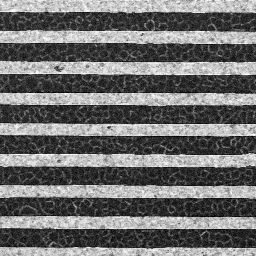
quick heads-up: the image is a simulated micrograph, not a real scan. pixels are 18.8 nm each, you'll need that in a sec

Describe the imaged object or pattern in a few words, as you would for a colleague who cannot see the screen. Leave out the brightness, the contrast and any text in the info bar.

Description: parallel lines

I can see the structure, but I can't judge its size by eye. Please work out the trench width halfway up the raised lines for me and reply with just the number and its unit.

19.3 pixels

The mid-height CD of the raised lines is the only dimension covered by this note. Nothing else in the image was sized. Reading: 221 nm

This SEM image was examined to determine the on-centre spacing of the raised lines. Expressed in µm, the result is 0.581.